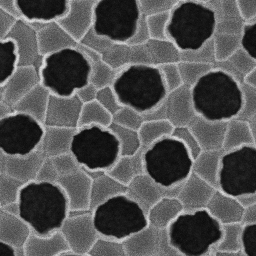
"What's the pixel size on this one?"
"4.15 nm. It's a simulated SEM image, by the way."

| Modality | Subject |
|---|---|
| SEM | a regular array of holes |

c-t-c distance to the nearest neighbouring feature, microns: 0.312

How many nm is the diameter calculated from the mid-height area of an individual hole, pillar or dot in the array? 187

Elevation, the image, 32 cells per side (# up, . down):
##......####.....######..#######
###.....####.....#####....######
############.....####......#####
############.....####......####.
#############...######....####..
..####################...#####..
..#####...#####################.
..####.....#####################
..####.....#####...#############
.####......####.....#####....###
######.....###......#####....###
#######..#####.......###......##
###############.....####......##
#################..######.....##
##.#######################...###
.....###########################
.....#####...###################
.....####......#####..##########
....#####......####....#######.#
#########......###......####....
###########...####......####....
###################.....####....
###################...######....
###....#####################....
###.....########################
###.....#####....###############
##......####......#######.######
###.....####......####.....#####
####...#####......###......####.
##############..#####.......##..
.#####################....####..
..#####################...#####.